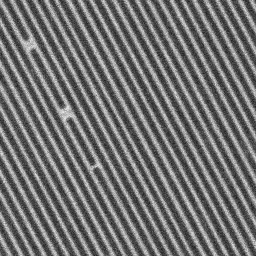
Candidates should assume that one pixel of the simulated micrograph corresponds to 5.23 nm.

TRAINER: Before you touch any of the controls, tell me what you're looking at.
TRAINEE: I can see parallel lines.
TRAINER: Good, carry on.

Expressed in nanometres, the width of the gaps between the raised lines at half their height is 34.6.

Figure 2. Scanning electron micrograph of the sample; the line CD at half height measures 0.015 microns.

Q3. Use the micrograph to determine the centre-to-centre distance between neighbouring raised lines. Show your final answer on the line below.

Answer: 0.0527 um